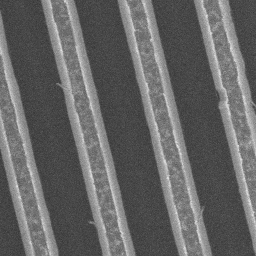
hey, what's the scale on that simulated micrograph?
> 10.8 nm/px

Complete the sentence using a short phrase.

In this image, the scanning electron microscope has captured one or a few lines or trenches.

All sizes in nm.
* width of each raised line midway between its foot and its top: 254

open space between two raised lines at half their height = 550 nm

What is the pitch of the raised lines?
0.802 µm